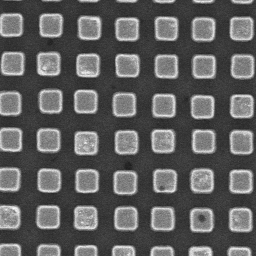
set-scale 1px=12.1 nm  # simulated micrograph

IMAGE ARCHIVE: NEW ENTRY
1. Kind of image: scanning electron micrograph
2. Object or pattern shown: a regular array of raised bodies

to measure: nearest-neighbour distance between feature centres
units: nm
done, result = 446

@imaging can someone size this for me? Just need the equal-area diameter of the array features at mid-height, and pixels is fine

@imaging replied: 25.4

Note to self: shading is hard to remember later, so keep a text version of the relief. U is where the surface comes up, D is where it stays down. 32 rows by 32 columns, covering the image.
DDDDDDDDDDDDDDDDDDDDDDDDDDDDDDDD
DDDDDDDDDDDDDDDDDDDDDDDDDDDDDDDD
UUUDDUUUDDUUDDDUUDDDUUDDUUUDDUUD
UUUDDUUUDDUUUDUUUDDUUUDDUUUDDUUU
DDDDDUUDDDUUDDDUUDDUUUDDUUUDDUUU
DDDDDDDDDDDDDDDDDDDDDDDDDDDDDDDD
DDDDDDDDDDDDDDDDDDDDDDDDDDDDDDDD
UUUDDUUDDDUUDDUUUDDUUUDDUUUDDUUU
UUUDDUUDDDUUDDUUUDDUUUDDUUUDDUUU
DDDDDDDDDDUUDDDUUDDDUUDDUUUDDUUD
DDDDDDDDDDDDDDDDDDDDDDDDDDDDDDDD
DDDDDUUUDUUUDDDDDDDDDDDDDDDDDDDD
UUUDDUUUDUUUDDUUUDDUUUDDUUUDDUUU
UUUDDUUUDUUUDDUUUDDUUUDDUUUDDUUU
DDDDDDDDDDDDDDDUUDDUUDDDUUUDDUUD
DDDDDDDDDDDDDDDDDDDDDDDDDDDDDDDD
UUUDDUUDDDDDDDDUUDDUUUDDUUUDDUUD
UUUDDUUDDUUUDDUUUDDUUUDDUUUDDUUU
UUUDDUUDDUUUDDUUUDDUUUDDUUUDDUUU
DDDDDDDDDDDDDDDDDDDDDDDDDDDDDDDD
DDDDDDDDDDDDDDDDDDDDDDDDDDDDDDDD
UUDDDUUDDDUUDDDUUDDUUUDDUUDDDUUD
UUDDDUUUDUUUDDUUUDDUUUDDUUUDDUUD
UUDDDUUUDUUUDDUUUDDUUUDDUUUDDUUD
DDDDDDDDDDDDDDDDDDDDDDDDDDDDDDDD
DDDDDDDDDDDDDDDDDDDDDDDDDDDDDDDD
UUDDDUUDDUUUDDUUUDDUUUDDUUUDDUUD
UUDDDUUDDUUUDDUUUDDUUUDDUUUDDUUD
UUDDDDUDDDUUDDDUUDDUUUDDUUUDDUUD
DDDDDDDDDDDDDDDDDDDDDDDDDDDDDDDD
DDDDDDDDDDDDDDDDDDDDDDDDDDDDDDDD
UUDDDUUDDUUUDDUUUDDUUUDDUUDDDUUD